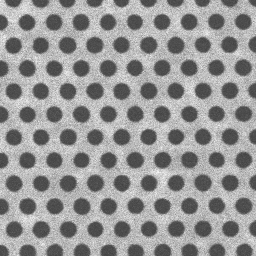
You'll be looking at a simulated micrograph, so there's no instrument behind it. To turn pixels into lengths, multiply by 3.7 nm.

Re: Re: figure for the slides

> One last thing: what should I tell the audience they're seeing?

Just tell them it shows a regular array of holes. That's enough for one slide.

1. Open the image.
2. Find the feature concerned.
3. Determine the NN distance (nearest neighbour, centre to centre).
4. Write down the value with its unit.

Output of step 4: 0.0979 um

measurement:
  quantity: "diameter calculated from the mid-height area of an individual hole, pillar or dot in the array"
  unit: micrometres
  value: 0.06